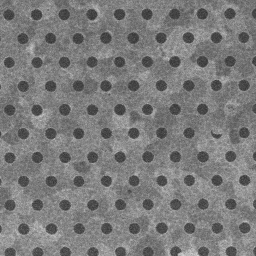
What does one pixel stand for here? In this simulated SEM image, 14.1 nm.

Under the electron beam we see a regular array of holes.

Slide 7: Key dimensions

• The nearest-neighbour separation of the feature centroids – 0.386 microns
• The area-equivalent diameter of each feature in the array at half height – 0.17 um